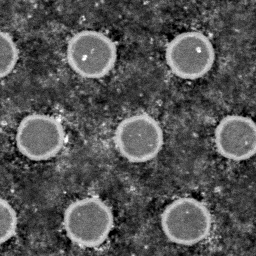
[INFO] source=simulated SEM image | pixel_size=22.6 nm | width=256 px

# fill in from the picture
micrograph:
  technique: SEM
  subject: raised bodies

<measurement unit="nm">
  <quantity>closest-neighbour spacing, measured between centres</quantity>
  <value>2200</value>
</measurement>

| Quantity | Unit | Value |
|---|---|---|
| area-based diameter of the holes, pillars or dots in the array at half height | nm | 996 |